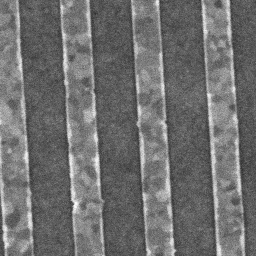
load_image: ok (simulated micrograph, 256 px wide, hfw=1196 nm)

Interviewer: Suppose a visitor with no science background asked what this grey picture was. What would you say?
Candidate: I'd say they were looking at one or a few lines or trenches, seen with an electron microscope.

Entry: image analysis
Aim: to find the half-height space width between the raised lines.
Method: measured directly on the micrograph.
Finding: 199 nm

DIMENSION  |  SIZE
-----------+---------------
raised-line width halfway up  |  130 nm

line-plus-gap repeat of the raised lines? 329 nm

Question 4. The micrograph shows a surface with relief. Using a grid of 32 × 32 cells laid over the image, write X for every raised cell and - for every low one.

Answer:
XX------XXX------XXX-----XXXX---
XX------XXX------XXX-----XXXX---
XX------XXX------XXX-----XXXX---
XX------XXX------XXX-----XXXX---
XXX-----XXX------XXX------XXX---
XX------XXX------XXX------XXX---
XXX-----XXX------XXX------XXX---
XXX-----XXX------XXX------XXX---
XXX-----XXXX-----XXX------XXX---
XXX-----XXXX-----XXX------XXX---
XXX-----XXXX-----XXX------XXX---
XXX-----XXXX-----XXX------XXX---
XXX-----XXXX-----XXX------XXX---
XXX-----XXXX-----XXXX-----XXX---
XXX-----XXXX-----XXXX-----XXXX--
XXX-----XXXX-----XXXX-----XXXX--
XXX-----XXXX-----XXXX-----XXXX--
XXX------XXX-----XXXX-----XXXX--
XXX------XXX------XXX-----XXXX--
XXX------XXX------XXX-----XXXX--
XXXX-----XXX------XXX------XXX--
XXXX-----XXX------XXX------XXX--
XXXX-----XXX------XXX------XXX--
XXXX-----XXX------XXX------XXX--
XXXX-----XXXX-----XXX------XXX--
XXXX-----XXXX-----XXX------XXX--
XXXX-----XXXX-----XXX------XXX--
XXXX-----XXXX-----XXX------XXX--
XXXX-----XXXX-----XXX------XXX--
XXXX-----XXXX-----XXXX-----XXX--
-XXX-----XXXX-----XXXX-----XXXX-
-XXX-----XXXX-----XXXX-----XXXX-